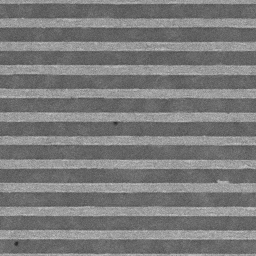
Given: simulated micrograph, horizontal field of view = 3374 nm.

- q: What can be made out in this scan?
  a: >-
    parallel lines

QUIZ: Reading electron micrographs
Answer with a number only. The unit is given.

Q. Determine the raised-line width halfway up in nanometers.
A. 110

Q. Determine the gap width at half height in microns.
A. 0.198